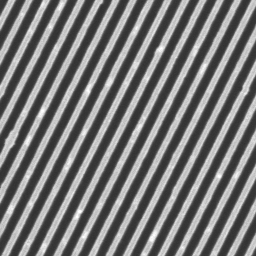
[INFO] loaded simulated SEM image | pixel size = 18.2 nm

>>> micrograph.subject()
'parallel lines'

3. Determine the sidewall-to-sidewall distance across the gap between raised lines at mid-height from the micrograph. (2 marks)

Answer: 8.82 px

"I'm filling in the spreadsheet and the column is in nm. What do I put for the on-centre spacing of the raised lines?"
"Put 283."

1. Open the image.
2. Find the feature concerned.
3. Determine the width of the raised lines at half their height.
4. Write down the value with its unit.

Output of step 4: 0.128 micrometres